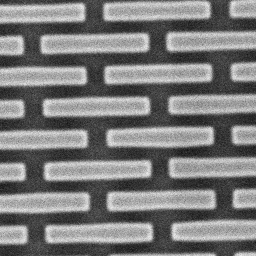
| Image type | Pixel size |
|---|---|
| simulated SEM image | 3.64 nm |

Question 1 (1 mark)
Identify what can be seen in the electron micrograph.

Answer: groups of lines, slits or small figures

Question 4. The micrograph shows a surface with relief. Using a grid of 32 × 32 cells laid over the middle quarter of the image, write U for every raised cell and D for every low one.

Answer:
DDDDDDDDDDDDDDDDDDDDDUUUUUUUUUUU
UUUUUDDDDDUUUUUUUUUUUUUUUUUUUUUU
UUUUUDDDDDUUUUUUUUUUUUUUUUUUUUUU
UUUUUDDDDDUUUUUUUUUUUUUUUUUUUUUU
UUUUUDDDDDUUUUUUUUUUUUDDDDDDDDDD
DDDDDDDDDDDDDDDDDDDDDDDDDDDDDDDD
DDDDDDDDDDDDDDDDDDDDDDDDDDDDDDDD
DDDDDDDDDDDDDDDDDDDDDDDDDDDDDDDD
DDDDDDDDDDDDDDUUUUUUUDDDDDDUUUUU
UUUUUUUUUUUUUUUUUUUUUDDDDDUUUUUU
UUUUUUUUUUUUUUUUUUUUUDDDDDUUUUUU
UUUUUUUUUUUUUUUUUUUUUDDDDDUUUUUU
UUUUUUUUUUUUUUUUUUUUDDDDDDDDDDDD
DDDDDDDDDDDDDDDDDDDDDDDDDDDDDDDD
DDDDDDDDDDDDDDDDDDDDDDDDDDDDDDDD
DDDDDDDDDDDDDDDDDDDDDDDDDDDDDDDD
DDDDDDDDDDDDUUUUUUUUUUUUUUUUUUUU
UUUUUUDDDDDUUUUUUUUUUUUUUUUUUUUU
UUUUUUDDDDDUUUUUUUUUUUUUUUUUUUUU
UUUUUUDDDDDUUUUUUUUUUUUUUUUUUUUU
UUUUUDDDDDDDDDDDDDDDDDDDUUUUUDDD
DDDDDDDDDDDDDDDDDDDDDDDDDDDDDDDD
DDDDDDDDDDDDDDDDDDDDDDDDDDDDDDDD
DDDDDDDDDDDDDDDDDDDDDDDDDDDDDDDD
DDUUUUUUUUUUUUUUUUUUUUDDDDUUUUUU
UUUUUUUUUUUUUUUUUUUUUUDDDDUUUUUU
UUUUUUUUUUUUUUUUUUUUUUDDDDUUUUUU
UUUUUUUUUUUUUUUUUUUUUUDDDDUUUUUU
UUUUUUUUUUDDDDDDDDDDDDDDDDDDDDDD
DDDDDDDDDDDDDDDDDDDDDDDDDDDDDDDD
DDDDDDDDDDDDDDDDDDDDDDDDDDDDDDDD
DDDDDDDDDDDDDDDDDDDDDDDDDDDDDDDD